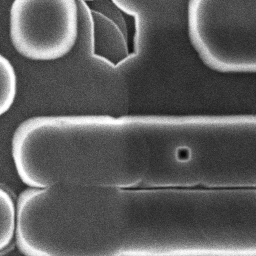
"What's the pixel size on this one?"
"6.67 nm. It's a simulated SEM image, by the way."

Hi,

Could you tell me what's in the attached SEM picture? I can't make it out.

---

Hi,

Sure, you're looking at wiring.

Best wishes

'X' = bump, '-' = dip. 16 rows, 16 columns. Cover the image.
-XXX--------XXXX
-XXXX-------XXXX
-XXX--------XXXX
-------------XXX
X---------------
X---------------
----------------
---XXXX-XXXXXXXX
-XXXXXXXXXXXXXXX
-XXXXXXXXXXXXXXX
-XXXXXXXXXXXXXXX
--XXXXXXXXXXXXXX
XXXXXXXXXXXXXXXX
XXXXXXXXXXXXXXXX
XXXXXXXXXXXXXXXX
--XXXXXXXXXXXXXX